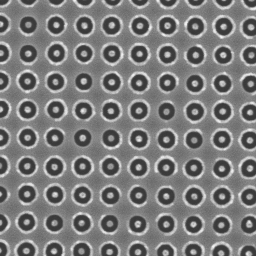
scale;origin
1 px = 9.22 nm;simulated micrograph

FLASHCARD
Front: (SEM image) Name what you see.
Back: a regular array of ring-shaped grooves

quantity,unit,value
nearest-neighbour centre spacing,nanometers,254